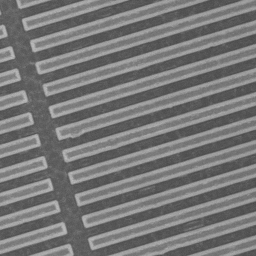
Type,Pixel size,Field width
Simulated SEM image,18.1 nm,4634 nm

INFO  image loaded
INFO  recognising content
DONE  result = parallel lines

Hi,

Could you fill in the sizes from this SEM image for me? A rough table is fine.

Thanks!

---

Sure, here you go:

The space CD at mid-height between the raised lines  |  0.253 µm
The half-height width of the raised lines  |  0.16 micrometres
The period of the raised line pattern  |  414 nm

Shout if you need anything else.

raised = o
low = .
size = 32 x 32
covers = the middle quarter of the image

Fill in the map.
...........ooooooooo............
........oooooooo............oooo
.....oooooooo...........oooooooo
..oooooooo...........oooooooo...
oooooo............oooooooo......
ooo............oooooooo.........
............ooooooo............o
.........ooooooo............oooo
.....oooooooo...........oooooooo
.oooooooo.............ooooooo...
oooooo............oooooooo......
ooo............oooooooo.........
...........oooooooo.............
........oooooooo............oooo
....ooooooooo............ooooooo
..ooooooo.............ooooooo...
oooooo............oooooooo......
oooo...........oooooooo.........
............ooooooo.............
........oooooooo............oooo
.....oooooooo............ooooooo
..ooooooo.............ooooooo...
oooooo............oooooooo......
ooo............ooooooo..........
............ooooooo............o
........oooooooo............oooo
.....oooooooo............ooooooo
..ooooooo............oooooooo...
..oooo............oooooooo......
...............ooooooo..........
............ooooooo............o
........oooooooo............oooo